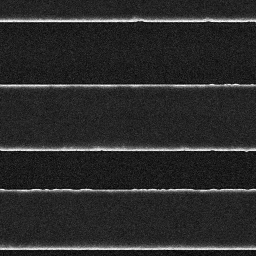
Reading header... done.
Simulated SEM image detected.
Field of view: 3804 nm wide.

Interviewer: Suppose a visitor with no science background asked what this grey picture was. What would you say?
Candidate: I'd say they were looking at lines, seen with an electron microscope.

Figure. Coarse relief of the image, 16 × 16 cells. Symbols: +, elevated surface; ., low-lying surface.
++++++++++++++++
................
................
................
................
++++++++++++++++
++++++++++++++++
++++++++++++++++
++++++++++++++++
................
................
................
++++++++++++++++
++++++++++++++++
++++++++++++++++
++++++++++++++++